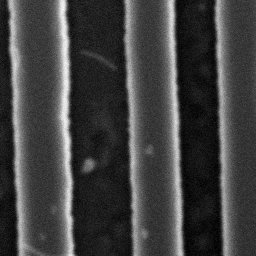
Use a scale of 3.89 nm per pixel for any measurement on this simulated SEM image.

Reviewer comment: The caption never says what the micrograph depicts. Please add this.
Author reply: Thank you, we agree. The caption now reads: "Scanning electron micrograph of lines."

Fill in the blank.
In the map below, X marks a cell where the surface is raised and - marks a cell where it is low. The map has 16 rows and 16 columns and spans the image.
-XXX----XXX---XX
-XXX----XXX---XX
-XXX----XXX---XX
-XXX----XXX---XX
-XXX----XXX---XX
-XXX----XXX---XX
-XXX----XXX---XX
-XXX----XXX---XX
-XXX----XXX---XX
-XXX----XXX---XX
-XXX----XXX---XX
-XXX----XXX---XX
-XXX----XXX---XX
-XXX----XXX---XX
-XXX----XXX---XX
-XXXX---XXX---XX